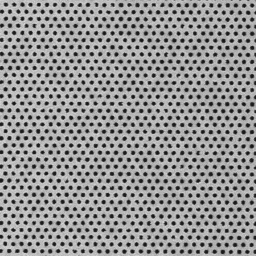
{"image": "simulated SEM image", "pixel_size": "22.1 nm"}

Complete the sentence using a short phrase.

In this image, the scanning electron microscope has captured a regular array of holes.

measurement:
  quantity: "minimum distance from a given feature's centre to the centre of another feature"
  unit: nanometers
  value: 170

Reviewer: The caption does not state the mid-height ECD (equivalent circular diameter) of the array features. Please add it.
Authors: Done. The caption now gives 99.7 nm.